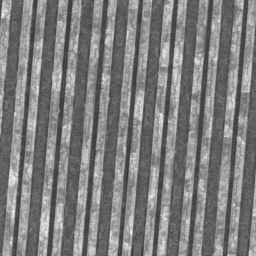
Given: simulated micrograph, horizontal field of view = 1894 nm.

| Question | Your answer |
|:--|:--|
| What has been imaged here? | parallel lines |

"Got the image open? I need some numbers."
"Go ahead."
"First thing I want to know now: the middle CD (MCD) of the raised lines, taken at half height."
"61.8 nanometers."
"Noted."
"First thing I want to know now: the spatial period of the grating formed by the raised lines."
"128 nm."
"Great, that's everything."